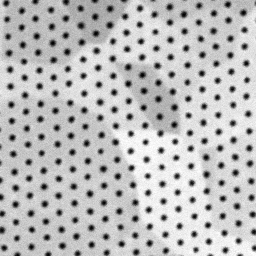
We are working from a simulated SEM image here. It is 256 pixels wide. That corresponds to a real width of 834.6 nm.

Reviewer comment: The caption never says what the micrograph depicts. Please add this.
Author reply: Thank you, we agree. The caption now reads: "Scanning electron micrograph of a regular array of holes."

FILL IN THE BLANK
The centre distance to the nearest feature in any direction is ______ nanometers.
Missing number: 52.7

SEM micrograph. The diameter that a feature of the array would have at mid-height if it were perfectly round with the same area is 21.7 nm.